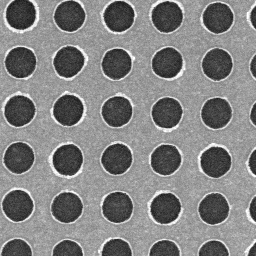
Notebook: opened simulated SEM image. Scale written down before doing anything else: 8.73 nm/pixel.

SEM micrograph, a regular array of holes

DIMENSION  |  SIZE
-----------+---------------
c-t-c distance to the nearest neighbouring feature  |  412 nm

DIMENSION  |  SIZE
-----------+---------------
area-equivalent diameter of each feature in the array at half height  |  277 nm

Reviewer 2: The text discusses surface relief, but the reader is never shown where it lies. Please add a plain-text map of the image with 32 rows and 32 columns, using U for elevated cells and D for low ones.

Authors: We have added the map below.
UDDDUUUDDDUUUUDDUUUUDDUUUUDDUUUU
UDDDUUUDDDDUUDDDDUUDDDDUUDDDDUUD
UDDDUUUDDDDUUDDDDUUDDDDUUDDDDUUD
UUDDUUUDDDUUUUDDUUUDDDUUUUDDDUUU
UUUUUUUUUUUUUUUUUUUUUUUUUUUUUUUU
UUUUUUUUUUUUUUUUUUUUUUUUUUUUUUUU
UDDDUUUDDDUUUDDDUUUUDDUUUUDDUUUU
UDDDUUUDDDDUUDDDUUUDDDDUUDDDDUUD
UDDDUUUDDDUUUDDDUUUDDDDUUDDDDUUD
UUDDUUUUDUUUUDDDUUUUDDUUUUDDUUUU
UUUUUUUUUUUUUUUUUUUUUUUUUUUUUUUU
UUUUUUUUUUUUUUUUUUUUUUUUUUUUUUUU
UDDDUUUDDDUUUDDDUUUUDDUUUUDDUUUU
UDDDUUUDDDUUUDDDDUUDDDDUUDDDDUUU
UDDDUUUDDDUUUDDDUUUDDDDUUDDDDUUD
UDDUUUUUDUUUUDDDUUUDDDUUUUDDUUUU
UUUUUUUUUUUUUUUUUUUUUUUUUUUUUUUU
UUUUUUUUUUUUUUUUUUUUUUUUUUUUUUUU
UDDDUUUDDDUUUDDDUUUUDDUUUUDDUUUU
DDDDUUUDDDUUUDDDDUUDDDDUUDDDDUUD
UDDDUUUDDDUUUDDDDUUDDDDUUDDDDUUD
UDDUUUUDDDUUUUDDUUUDDDUUUDDDUUUD
UUUUUUUUUUUUUUUUUUUUUUUUUUUUUUUU
UUUUUUUUUUUUUUUUUUUUUUUUUUUUUUUU
UDDDUUUDDDUUUDDDUUUUDDUUUUDDUUUU
DDDDUUDDDDUUUDDDDUUDDDDUUDDDDUUD
DDDDUUDDDDUUUDDDDUUDDDDUUDDDDUUD
UDDUUUUDDDUUUDDDUUUDDDUUUDDDUUUU
UUUUUUUUUUUUUUUUUUUUUUUUUUUUUUUU
UUUUUUUUUUUUUUUUUUUUUUUUUUUUUUUU
UDDUUUUDDDUUUDDDUUUDDDUUUDDDUUUU
DDDDUUUDDDUUUDDDDUUDDDUUUDDDDUUD